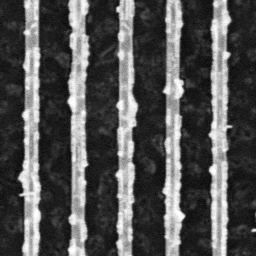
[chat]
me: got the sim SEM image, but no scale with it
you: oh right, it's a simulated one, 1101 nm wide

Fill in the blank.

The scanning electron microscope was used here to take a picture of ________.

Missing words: parallel lines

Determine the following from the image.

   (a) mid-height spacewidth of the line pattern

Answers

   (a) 0.14 microns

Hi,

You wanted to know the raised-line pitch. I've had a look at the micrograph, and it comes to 202 nanometres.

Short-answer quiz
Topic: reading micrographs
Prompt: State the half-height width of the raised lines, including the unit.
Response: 0.0602 um